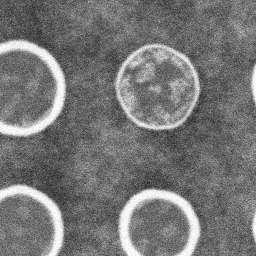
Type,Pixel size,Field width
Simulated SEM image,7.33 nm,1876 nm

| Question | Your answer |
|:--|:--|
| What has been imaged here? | raised bodies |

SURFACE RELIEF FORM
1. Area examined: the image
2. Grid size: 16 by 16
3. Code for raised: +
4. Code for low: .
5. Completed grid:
................
................
................
+++.............
++++............
++++............
++++............
+++.............
................
................
................
................
+++......++.....
++++....++++....
++++....++++....
++++....++++....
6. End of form